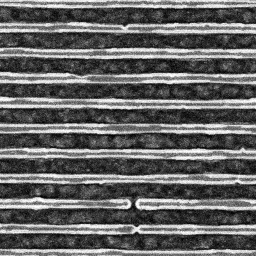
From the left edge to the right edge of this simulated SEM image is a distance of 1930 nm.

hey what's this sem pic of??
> parallel lines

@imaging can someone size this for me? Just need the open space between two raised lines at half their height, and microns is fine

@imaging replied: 0.128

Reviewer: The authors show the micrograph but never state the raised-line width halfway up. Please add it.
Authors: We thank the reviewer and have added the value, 0.0641 micrometres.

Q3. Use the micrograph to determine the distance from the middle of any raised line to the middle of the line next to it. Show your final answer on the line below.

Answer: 190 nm